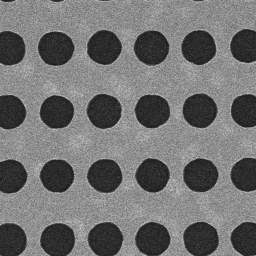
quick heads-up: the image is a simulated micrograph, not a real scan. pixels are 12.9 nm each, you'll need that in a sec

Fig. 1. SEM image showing a regular array of holes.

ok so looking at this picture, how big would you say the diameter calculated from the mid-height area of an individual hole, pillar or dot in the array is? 448 nm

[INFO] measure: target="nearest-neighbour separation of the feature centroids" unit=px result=47.6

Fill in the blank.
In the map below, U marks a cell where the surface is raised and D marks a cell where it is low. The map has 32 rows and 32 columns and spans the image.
UUUUUUUUUUUUUUUUUUUUUUUUUUUUUUUU
UUUUUUUUUUUUUUUUUUUUUUUUUUUUUUUU
UUUUUUUUUUUUUUUUUUUUUUUUUUUUUUUU
UUUUUUUUUUUUUUUUUUUUUUUUUUUUUUUU
DDUUUDDDDUUDDDDUUDDDDUUDDDUUUDDD
DDDUUDDDDUUDDDDUUDDDDUUDDDDUUDDD
DDDUUDDDDUUDDDDUUDDDDUUDDDDUUDDD
DDDUUDDDDUUUDDUUUDDDUUUDDDUUUUDD
UUUUUUUUUUUUUUUUUUUUUUUUUUUUUUUU
UUUUUUUUUUUUUUUUUUUUUUUUUUUUUUUU
UUUUUUUUUUUUUUUUUUUUUUUUUUUUUUUU
UUUUUUUUUUUUUUUUUUUUUUUUUUUUUUUU
DDDUUUDDDUUDDDDUUDDDDUUDDDDUUDDD
DDDUUDDDDUUDDDDUUDDDDUUDDDDUUDDD
DDDUUDDDDUUDDDDUUDDDDUUDDDDUUDDD
DDDUUUDDDUUUDDUUUUDDUUUUDDUUUUDD
UUUUUUUUUUUUUUUUUUUUUUUUUUUUUUUU
UUUUUUUUUUUUUUUUUUUUUUUUUUUUUUUU
UUUUUUUUUUUUUUUUUUUUUUUUUUUUUUUU
UUUUUUUUUUUUUUUUUUUUUUUUUUUUUUUU
DDDUUUDDDUUUDDDUUUDDDUUDDDDUUDDD
DDDUUDDDDUUDDDDUUDDDDUUDDDDUUDDD
DDDUUDDDDUUDDDDUUDDDDUUDDDDUUDDD
DDDUUUDDDUUUDDDUUUDDUUUUDDUUUUDD
UUUUUUUUUUUUUUUUUUUUUUUUUUUUUUUU
UUUUUUUUUUUUUUUUUUUUUUUUUUUUUUUU
UUUUUUUUUUUUUUUUUUUUUUUUUUUUUUUU
UUUUUUUUUUUUUUUUUUUUUUUUUUUUUUUU
DDDUUUDDDUUUDDDUUUDDDUUDDDDUUDDD
DDDUUDDDDUUDDDDUUDDDDUUDDDDUUDDD
DDDUUDDDDUUDDDDUUDDDDUUDDDDUUDDD
DDDUUUDDDUUUDDDUUUDDDUUUDDDUUUDD